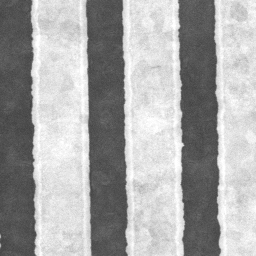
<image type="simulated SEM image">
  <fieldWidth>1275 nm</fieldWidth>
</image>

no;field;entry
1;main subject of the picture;one or a few lines or trenches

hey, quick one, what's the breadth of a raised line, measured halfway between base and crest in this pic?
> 247 nm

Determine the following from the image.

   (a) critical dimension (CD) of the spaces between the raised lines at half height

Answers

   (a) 214 nm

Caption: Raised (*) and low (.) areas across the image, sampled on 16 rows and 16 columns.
..***...***...**
..***...***...**
..***...***...**
..***...***...**
..***...***...**
..***...***...**
..***...***...**
..***...***...**
..***...***...**
..***...***...**
..***...***...**
..***...***...**
..***...***...**
..***...***...**
..***...***...**
..***...***...**